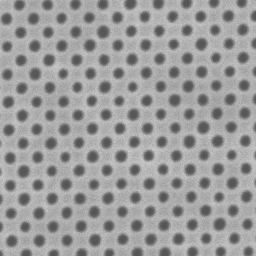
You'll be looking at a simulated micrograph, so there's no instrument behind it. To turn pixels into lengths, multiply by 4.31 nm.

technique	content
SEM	a regular array of holes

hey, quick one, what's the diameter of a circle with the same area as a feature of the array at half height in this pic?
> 0.0501 um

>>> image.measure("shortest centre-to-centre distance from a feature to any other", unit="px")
19.4